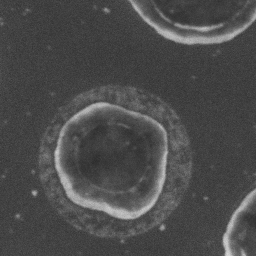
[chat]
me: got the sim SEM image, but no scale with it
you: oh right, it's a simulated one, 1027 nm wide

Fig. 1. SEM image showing raised bodies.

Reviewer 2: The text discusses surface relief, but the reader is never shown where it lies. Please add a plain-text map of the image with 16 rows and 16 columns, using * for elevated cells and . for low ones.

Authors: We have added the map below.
........********
.........*******
............*...
................
................
................
................
....******......
....******......
....******......
....******......
....******......
.....*****.....*
...............*
..............**
..............**